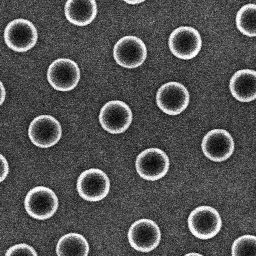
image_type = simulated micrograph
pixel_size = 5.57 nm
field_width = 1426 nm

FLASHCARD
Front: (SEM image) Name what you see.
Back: a regular array of raised bodies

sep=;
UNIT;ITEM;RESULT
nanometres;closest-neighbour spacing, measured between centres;324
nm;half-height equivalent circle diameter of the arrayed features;174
